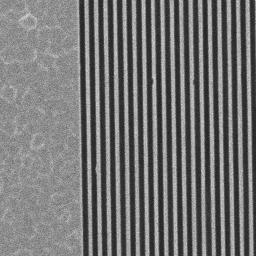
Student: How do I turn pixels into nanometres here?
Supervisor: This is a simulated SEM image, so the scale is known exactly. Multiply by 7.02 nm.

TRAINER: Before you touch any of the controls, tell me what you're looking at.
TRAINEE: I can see parallel lines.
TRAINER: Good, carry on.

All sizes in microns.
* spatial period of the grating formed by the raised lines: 0.0665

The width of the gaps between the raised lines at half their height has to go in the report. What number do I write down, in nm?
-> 35.1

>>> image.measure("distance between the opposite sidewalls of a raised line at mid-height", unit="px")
4